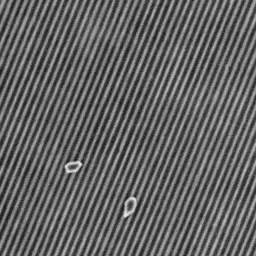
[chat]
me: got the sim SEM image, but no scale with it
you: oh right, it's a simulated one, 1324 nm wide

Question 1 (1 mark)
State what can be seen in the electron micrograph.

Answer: parallel lines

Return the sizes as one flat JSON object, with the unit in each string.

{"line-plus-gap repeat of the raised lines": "35.4 nm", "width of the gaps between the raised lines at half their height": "22.2 nm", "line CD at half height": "2.9 px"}